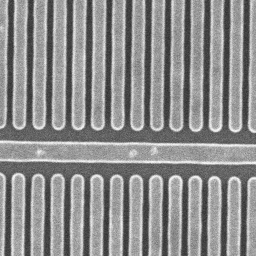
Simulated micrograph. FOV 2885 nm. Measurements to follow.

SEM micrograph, groups of lines, slits or small figures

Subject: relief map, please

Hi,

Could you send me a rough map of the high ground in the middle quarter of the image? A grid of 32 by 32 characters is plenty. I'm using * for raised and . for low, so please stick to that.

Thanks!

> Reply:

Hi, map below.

..***..***..***..***..***..***..
..***..***..***..***..***..***..
..***..***..***..***..***..***..
..***..***..***..***..***..***..
..***..***..***..***..***..***..
..***..***..***..***..***..***..
..***..***..***..***..***..***..
..***..***..***..***..***..***..
..***..***..***..***..***..***..
..***..***..***..***..***..***..
..***..***..***..***..***..***..
..***..***..***..***..***..***..
..***..***..***..***..***..***.*
..***..***..***..***..***..***.*
..***..***..***..***..***..***.*
..***..***..***..***..***..***.*
...........................**...
................................
................................
................................
********************************
********************************
********************************
********************************
......**..**********************
................................
................................
................................
..***..***..**...**...**...**...
..***..***..***.****.***..***..*
..***..***..***.****.***..***..*
..***..***..***.****.***..***..*